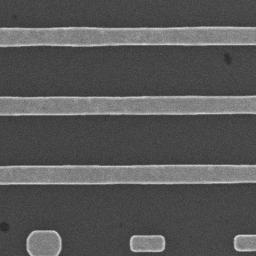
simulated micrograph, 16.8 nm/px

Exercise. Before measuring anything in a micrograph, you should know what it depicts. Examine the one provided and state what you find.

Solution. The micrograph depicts wiring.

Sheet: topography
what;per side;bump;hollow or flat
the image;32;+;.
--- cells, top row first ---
................................
................................
................................
........+++...........++++++++++
++++++++++++++++++++++++++++++++
++++++++++++++++++++++++++++++++
................................
................................
................................
................................
................................
................................
++++++++++++++++++++++++++++++++
++++++++++++++++++++++++++++++++
................................
................................
................................
................................
................................
................................
................................
++++++++++++++++++++++++++++++++
++++++++++++++++++++++++++++++++
................................
................................
................................
................................
................................
................................
....+++..........+++..........++
...+++++........+++++........+++
....+++.........................